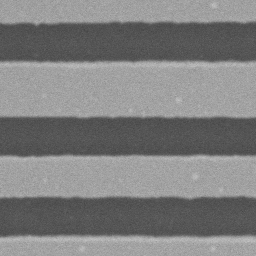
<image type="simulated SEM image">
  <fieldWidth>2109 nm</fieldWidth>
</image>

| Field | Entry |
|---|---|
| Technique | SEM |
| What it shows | lines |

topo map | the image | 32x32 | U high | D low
UUUUUUUUUUUUUUUUUUUUUUUUUUUUUUUU
UUUUUUUUUUUUUUUUUUUUUUUUUUUUUUUU
UUUUUUUUUUUUUUUUUUUUUUUUUUUUUUUU
DDDDDDDDDDDDDDDDDDDDDDDDDDDDDDDD
DDDDDDDDDDDDDDDDDDDDDDDDDDDDDDDD
DDDDDDDDDDDDDDDDDDDDDDDDDDDDDDDD
DDDDDDDDDDDDDDDDDDDDDDDDDDDDDDDD
DDDDDDDDDDDDDDDDDDDDDDDDDDDDDDDD
UUUUUUUUUUUUUUUUUUUUUUUUUUUUUUUU
UUUUUUUUUUUUUUUUUUUUUUUUUUUUUUUU
UUUUUUUUUUUUUUUUUUUUUUUUUUUUUUUU
UUUUUUUUUUUUUUUUUUUUUUUUUUUUUUUU
UUUUUUUUUUUUUUUUUUUUUUUUUUUUUUUU
UUUUUUUUUUUUUUUUUUUUUUUUUUUUUUUU
UUUUUUUUUUUUUUUUUUUUUUUUUUUUUUUU
DDDDDDDDDDDDDDDDDDDDDDDDDDDDDDDD
DDDDDDDDDDDDDDDDDDDDDDDDDDDDDDDD
DDDDDDDDDDDDDDDDDDDDDDDDDDDDDDDD
DDDDDDDDDDDDDDDDDDDDDDDDDDDDDDDD
DDDDDDDDDDDDDDDDDDDDDDDDUUDDDDDD
UUUUUUUUUUUUUUUUUUUUUUUUUUUUUUUU
UUUUUUUUUUUUUUUUUUUUUUUUUUUUUUUU
UUUUUUUUUUUUUUUUUUUUUUUUUUUUUUUU
UUUUUUUUUUUUUUUUUUUUUUUUUUUUUUUU
UUUUUUUUUUUUUUUUUUUUUUUUUUUUUUUU
DDDDDDDDDDDDDDDDDDDDDDDDDDDDDDDD
DDDDDDDDDDDDDDDDDDDDDDDDDDDDDDDD
DDDDDDDDDDDDDDDDDDDDDDDDDDDDDDDD
DDDDDDDDDDDDDDDDDDDDDDDDDDDDDDDD
DDDDDDDDDDDDDDDDDDDDDDDDDDDDDDDD
UUUUUUUUUUUUUUUUUUUUUUUUUUUUUUUU
UUUUUUUUUUUUUUUUUUUUUUUUUUUUUUUU